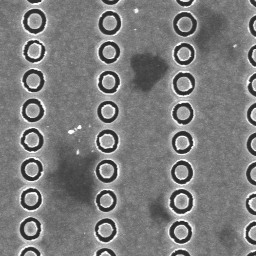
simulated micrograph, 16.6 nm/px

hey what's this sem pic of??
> a regular array of ring-shaped grooves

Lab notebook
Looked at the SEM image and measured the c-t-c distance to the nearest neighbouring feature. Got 0.485 micrometres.